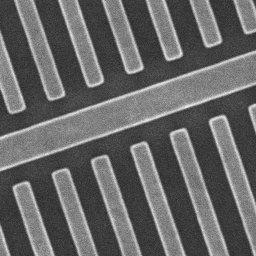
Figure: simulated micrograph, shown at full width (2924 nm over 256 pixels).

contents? groups of lines, slits or small figures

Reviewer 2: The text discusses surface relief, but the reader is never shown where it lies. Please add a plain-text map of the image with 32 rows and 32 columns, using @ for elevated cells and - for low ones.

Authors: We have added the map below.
--@@---@@@---@@---@@@---@@---@@@
--@@@---@@---@@@---@@---@@@---@@
---@@---@@----@@---@@----@@---@@
---@@---@@@---@@---@@@---@@---@@
---@@@---@@---@@@---@@---@@@----
@---@@---@@----@@---@@----@-----
@---@@----@@---@@---@@@--------@
@---@@@---@@---@@@---@-------@@@
@@---@@---@@----@@--------@@@@@@
@@---@@----@@----------@@@@@@@@@
@@---@@@---@--------@@@@@@@@@@@@
@@@---@@---------@@@@@@@@@@@@---
-@@---@-------@@@@@@@@@@@@------
-@@--------@@@@@@@@@@@@--------@
--------@@@@@@@@@@@@-------@---@
-----@@@@@@@@@@@@---------@@@---
--@@@@@@@@@@@@@-------@----@@---
@@@@@@@@@@@----------@@@---@@---
@@@@@@@@@-------@@@---@@---@@@--
@@@@@------------@@---@@----@@--
@@----------@@---@@---@@@---@@--
-------@@---@@---@@@---@@---@@@-
-------@@---@@@---@@---@@----@@-
--@@---@@---@@@---@@---@@@---@@-
--@@---@@@---@@---@@@---@@---@@@
--@@@---@@---@@@---@@---@@----@@
---@@---@@----@@---@@---@@@---@@
---@@---@@@---@@---@@@---@@---@@
---@@@---@@---@@@---@@---@@----@
----@@---@@----@@---@@---@@@---@
@---@@---@@@---@@---@@@---@@---@
@---@@@---@@---@@----@@---@@----